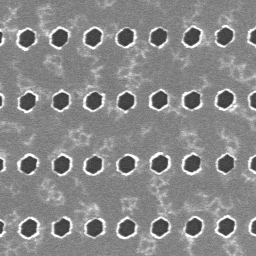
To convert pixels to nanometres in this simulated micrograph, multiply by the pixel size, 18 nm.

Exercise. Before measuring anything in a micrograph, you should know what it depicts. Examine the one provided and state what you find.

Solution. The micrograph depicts a regular array of holes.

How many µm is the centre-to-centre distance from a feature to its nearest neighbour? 0.588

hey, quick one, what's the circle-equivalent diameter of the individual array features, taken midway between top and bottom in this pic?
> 0.318 µm